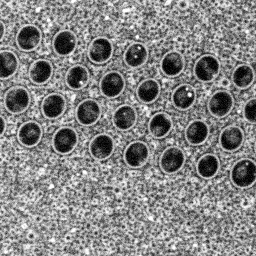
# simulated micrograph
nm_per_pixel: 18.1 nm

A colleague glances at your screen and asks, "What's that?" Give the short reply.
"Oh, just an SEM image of a regular array of raised bodies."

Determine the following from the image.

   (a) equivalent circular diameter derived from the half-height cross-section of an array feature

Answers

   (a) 459 nm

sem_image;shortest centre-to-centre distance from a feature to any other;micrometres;0.644